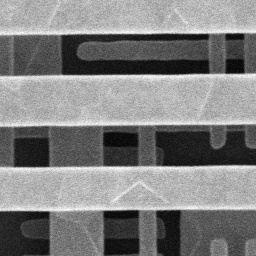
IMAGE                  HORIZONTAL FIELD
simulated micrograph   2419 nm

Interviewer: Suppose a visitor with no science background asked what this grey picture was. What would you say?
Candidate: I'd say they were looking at wiring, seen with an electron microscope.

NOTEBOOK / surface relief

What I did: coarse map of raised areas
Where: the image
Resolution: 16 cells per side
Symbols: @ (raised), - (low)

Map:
@@@@@@@@@@@@@@@@
@@@@@@@@@@@@@@@@
----------------
----------------
----------------
@@@@@@@@@@@@@@@@
@@@@@@@@@@@@@@@@
@@@@@@@@@@@@@@@@
----------------
----------------
@@@@@@@@@@@@@@@@
@@@@@@@@@@@@@@@@
@@@@@@@@@@@@@@@@
----------------
----------------
----------------